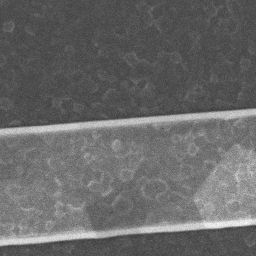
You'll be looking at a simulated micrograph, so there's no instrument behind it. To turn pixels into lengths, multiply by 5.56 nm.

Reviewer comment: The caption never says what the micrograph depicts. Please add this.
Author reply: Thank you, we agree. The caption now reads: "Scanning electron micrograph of one or a few lines or trenches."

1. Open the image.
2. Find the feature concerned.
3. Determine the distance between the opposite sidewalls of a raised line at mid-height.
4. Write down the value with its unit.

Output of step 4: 0.615 microns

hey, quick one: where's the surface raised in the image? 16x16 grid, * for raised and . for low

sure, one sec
................
................
................
................
................
................
................
.........*******
****************
****************
****************
****************
****************
****************
********........
................